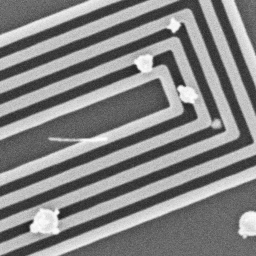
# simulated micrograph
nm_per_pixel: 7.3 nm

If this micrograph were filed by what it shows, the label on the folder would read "groups of lines, slits or small figures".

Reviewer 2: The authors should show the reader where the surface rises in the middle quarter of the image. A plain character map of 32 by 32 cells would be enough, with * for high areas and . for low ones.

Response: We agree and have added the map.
*........*******..****.**....**.
.......******......*******...***
....*******........*******...***
.*******........*******.***...**
******.......*******.....**...**
***........*******.......***...*
*........*******.........*******
......*******.............**.***
...*******................******
.*******..................***..*
*****......................**...
***......................*****..
......................*******...
....................*******.....
.................*******........
...............*******........**
.............******........*****
..........*******........******.
.......*******........*******...
....********........*******.....
..*******........*******.......*
******........*******........***
****.......********.......******
**.......*******........*******.
.......*******.......*******....
....*******........*******......
.********.......*******........*
******........*******.......****
****.......*******........******
*........*******.......*******..
......*******........*******....
....******........*******.......